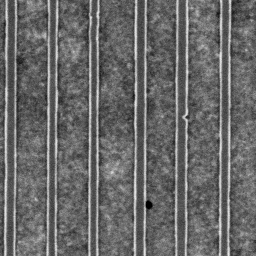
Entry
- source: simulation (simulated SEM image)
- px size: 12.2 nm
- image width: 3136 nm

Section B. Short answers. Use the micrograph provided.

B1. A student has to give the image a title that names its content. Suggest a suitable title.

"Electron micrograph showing parallel lines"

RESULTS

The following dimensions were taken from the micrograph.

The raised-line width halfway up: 119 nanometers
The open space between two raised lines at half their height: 401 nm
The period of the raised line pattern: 0.525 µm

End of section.